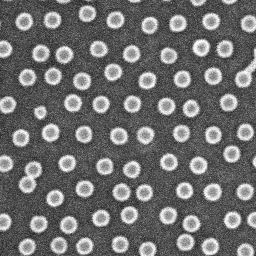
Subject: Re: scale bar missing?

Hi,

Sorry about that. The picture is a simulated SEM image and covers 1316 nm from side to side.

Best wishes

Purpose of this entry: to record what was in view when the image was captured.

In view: a regular array of raised bodies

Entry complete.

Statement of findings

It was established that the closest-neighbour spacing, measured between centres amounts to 139 nm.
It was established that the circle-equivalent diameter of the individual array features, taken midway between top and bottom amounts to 0.0775 microns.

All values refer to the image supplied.